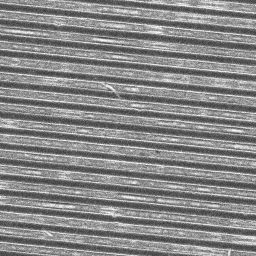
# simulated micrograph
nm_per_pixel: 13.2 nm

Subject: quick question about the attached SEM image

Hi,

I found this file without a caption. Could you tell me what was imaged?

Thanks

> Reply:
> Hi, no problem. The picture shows parallel lines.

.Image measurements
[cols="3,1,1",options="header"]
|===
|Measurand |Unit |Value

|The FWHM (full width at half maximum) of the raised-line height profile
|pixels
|8.34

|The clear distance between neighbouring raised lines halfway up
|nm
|99.9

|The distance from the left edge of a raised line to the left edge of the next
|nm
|203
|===